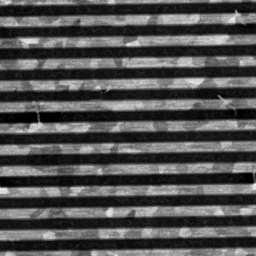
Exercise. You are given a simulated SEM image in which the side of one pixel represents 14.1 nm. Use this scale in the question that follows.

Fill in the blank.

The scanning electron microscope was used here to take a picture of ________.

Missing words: parallel lines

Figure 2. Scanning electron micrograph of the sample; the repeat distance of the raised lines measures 302 nm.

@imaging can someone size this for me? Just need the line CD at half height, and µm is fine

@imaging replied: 0.14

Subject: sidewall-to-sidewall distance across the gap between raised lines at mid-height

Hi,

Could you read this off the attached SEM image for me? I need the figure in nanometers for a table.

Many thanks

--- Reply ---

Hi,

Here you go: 166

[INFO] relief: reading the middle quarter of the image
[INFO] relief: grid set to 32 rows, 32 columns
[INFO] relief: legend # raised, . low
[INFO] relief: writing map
###############################.
................................
................................
................................
################################
################################
..........#.....................
................................
................................
...#############################
################################
###################.............
................................
................................
...............#################
################################
###############################.
................................
................................
................................
################################
################################
................................
................................
................................
...#############################
################################
###################.............
................................
................................
...............#############.###
################################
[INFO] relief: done